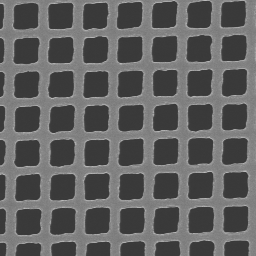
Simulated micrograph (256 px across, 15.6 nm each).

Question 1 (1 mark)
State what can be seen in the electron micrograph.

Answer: a regular array of holes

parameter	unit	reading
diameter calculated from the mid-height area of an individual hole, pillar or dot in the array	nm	438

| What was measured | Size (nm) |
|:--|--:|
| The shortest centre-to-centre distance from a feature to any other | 533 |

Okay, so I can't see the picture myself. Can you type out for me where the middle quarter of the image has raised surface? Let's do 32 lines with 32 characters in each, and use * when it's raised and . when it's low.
********************************
*****************..****.**..****
..***......***......**.......**.
...**......**.......**.......**.
...**......**.......**.......**.
...**......**.......**......***.
..***......**.......**......***.
..***......**......***......***.
*****.**************************
********************************
..****....****......***.....****
...**......***......**.......**.
...**......***......***......**.
...**......***......**.......**.
...**......***......**......***.
..***......**.......**......***.
..***......***.....****.....****
********************************
**************************..****
...***.....***......***......**.
...**......***......**.......**.
...**......***......**.......**.
...**......***......**.......**.
...**......**.......**.......**.
..***......**.......**......***.
******..******..****************
********************************
..****.....****.....***.....****
...**.......**......***......**.
...**......***......**.......**.
...**......***......**.......**.
...**......***......**.......**.